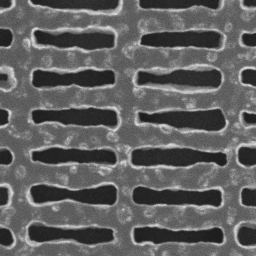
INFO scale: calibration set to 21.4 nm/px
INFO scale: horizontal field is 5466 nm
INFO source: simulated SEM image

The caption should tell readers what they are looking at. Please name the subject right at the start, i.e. a regular array of holes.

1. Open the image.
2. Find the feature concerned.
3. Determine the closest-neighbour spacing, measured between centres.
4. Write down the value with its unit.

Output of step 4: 0.834 microns